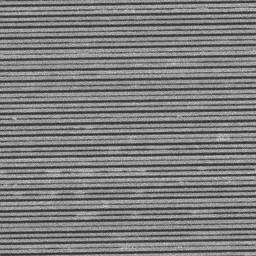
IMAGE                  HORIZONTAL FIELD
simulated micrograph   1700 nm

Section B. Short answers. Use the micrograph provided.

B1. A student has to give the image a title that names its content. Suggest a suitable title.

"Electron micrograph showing parallel lines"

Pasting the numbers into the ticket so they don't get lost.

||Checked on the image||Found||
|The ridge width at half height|0.0232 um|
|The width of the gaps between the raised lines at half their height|0.0174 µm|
